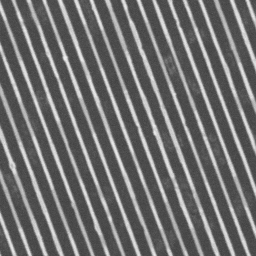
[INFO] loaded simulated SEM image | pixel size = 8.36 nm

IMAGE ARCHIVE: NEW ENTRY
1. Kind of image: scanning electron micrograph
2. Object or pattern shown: parallel lines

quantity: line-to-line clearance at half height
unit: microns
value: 0.097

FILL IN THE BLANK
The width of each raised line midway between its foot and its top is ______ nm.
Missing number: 24.5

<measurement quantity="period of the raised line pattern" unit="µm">0.122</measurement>